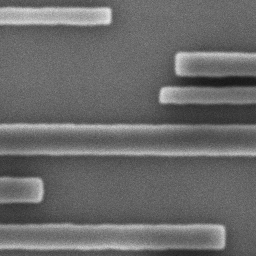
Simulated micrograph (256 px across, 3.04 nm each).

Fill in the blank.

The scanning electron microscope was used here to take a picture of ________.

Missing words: groups of lines, slits or small figures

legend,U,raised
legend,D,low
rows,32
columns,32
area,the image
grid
DDDDDDDDDDDDDDDDDDDDDDDDDDDDDDDD
UUUUUUUUUUUUUUDDDDDDDDDDDDDDDDDD
UUUUUUUUUUUUUUDDDDDDDDDDDDDDDDDD
DDDDDDDDDDDDDDDDDDDDDDDDDDDDDDDD
DDDDDDDDDDDDDDDDDDDDDDDDDDDDDDDD
DDDDDDDDDDDDDDDDDDDDDDDDDDDDDDDD
DDDDDDDDDDDDDDDDDDDDDDDDDDDDDDDD
DDDDDDDDDDDDDDDDDDDDDDUUUUUUUUUU
DDDDDDDDDDDDDDDDDDDDDDUUUUUUUUUU
DDDDDDDDDDDDDDDDDDDDDDDDDDDUDDDD
DDDDDDDDDDDDDDDDDDDDDDDDDDDDDDDD
DDDDDDDDDDDDDDDDDDDDUUUUUUUUUUUU
DDDDDDDDDDDDDDDDDDDDUUUUUUUUUUUU
DDDDDDDDDDDDDDDDDDDDDDDDDDDDDDDD
DDDDDDDDDDDDDDDDDDDDDDDDDDDDDDDD
DDDDDDDDDDDDDDDDDDDDDDDDDDDDDDDD
UUUUUUUUUUUUUUUUUUUUUUUUUUUUUUUU
UUUUUUUUUUUUUUUUUUUUUUUUUUUUUUUU
UUUUUUUUUUUUUUUUUUUUUUUUUUUUUUUU
DDDDDDDDDDDDDDDDDDDDDDDDDDDDDDDD
DDDDDDDDDDDDDDDDDDDDDDDDDDDDDDDD
DDDDDDDDDDDDDDDDDDDDDDDDDDDDDDDD
UUUUUDDDDDDDDDDDDDDDDDDDDDDDDDDD
UUUUUDDDDDDDDDDDDDDDDDDDDDDDDDDD
UUUUUDDDDDDDDDDDDDDDDDDDDDDDDDDD
DDDDDDDDDDDDDDDDDDDDDDDDDDDDDDDD
DDDDDDDDDDDDDDDDDDDDDDDDDDDDDDDD
DDDDDDDDDDDDDDDDDDDDDDDDDDDDDDDD
UUUUUUUUUUUUUUUUUUUUUUUUUUUUDDDD
UUUUUUUUUUUUUUUUUUUUUUUUUUUUDDDD
UUUUUUUUUUUUUUUUUUUUUUUUUUUUDDDD
DDDDDDDDDDDDDDDDDDDDDDDDDDDDDDDD